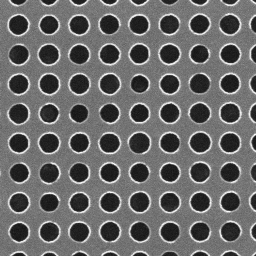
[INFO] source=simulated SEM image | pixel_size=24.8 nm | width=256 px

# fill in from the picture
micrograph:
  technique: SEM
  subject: a regular array of holes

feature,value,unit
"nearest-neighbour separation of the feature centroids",29.5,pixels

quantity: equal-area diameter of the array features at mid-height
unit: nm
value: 484